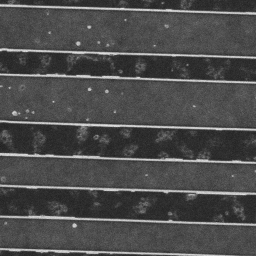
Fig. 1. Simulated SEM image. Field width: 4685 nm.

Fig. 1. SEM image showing one or a few lines or trenches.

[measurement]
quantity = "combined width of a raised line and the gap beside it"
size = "1.27 µm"